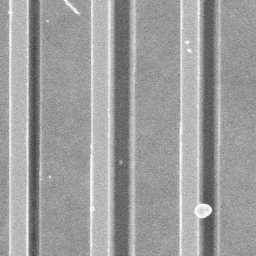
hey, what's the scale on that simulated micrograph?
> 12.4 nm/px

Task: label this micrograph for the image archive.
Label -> lines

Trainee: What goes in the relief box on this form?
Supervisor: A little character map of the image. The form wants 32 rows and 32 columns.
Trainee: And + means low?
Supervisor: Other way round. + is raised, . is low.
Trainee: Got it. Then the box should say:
++++.+++++++++...++++++++..+++++
++++.+++++++++...++++++++..+++++
++++.+++++++++...++++++++..+++++
+++..+++++++++...++++++++..+++++
+++..+++++++++...++++++++..+++++
++++.+++++++++...++++++++..+++++
+++..+++++++++...++++++++..+++++
+++..+++++++++...++++++++..+++++
+++..+++++++++...++++++++..+++++
+++..+++++++++...++++++++..+++++
+++..+++++++++...++++++++..+++++
+++..+++++++++...++++++++..+++++
+++..+++++++++...++++++++..+++++
+++..+++++++++...++++++++..+++++
+++..+++++++++...++++++++..+++++
+++..+++++++++...++++++++..+++++
+++..+++++++++...++++++++..+++++
+++..+++++++++...++++++++..+++++
+++..+++++++++...++++++++..+++++
+++..+++++++++...++++++++..+++++
+++..+++++++++...++++++++..+++++
+++..+++++++++...++++++++..+++++
+++..+++++++++...++++++++..+++++
+++..+++++++++...++++++++..+++++
+++..+++++++++...++++++++..+++++
+++..+++++++++...++++++++..+++++
+++..+++++++++...+++++++++.+++++
+++..+++++++++...++++++++..+++++
+++..+++++++++...++++++++..+++++
+++..+++++++++...++++++++..+++++
+++..+++++++++...++++++++..+++++
+++..+++++++++...++++++++..+++++